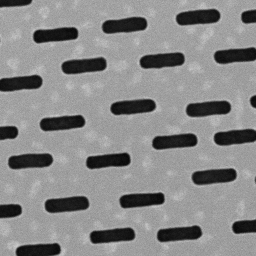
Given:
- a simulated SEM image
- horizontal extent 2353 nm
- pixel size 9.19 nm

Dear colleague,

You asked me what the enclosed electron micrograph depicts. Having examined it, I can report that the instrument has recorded a regular array of holes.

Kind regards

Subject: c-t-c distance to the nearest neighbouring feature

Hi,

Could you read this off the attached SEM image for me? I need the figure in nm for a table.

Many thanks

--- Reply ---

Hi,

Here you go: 463